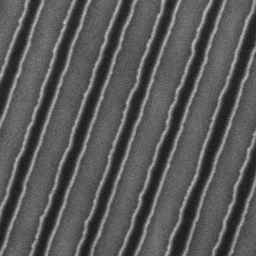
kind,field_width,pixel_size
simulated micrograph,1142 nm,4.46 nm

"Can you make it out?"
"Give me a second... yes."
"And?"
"lines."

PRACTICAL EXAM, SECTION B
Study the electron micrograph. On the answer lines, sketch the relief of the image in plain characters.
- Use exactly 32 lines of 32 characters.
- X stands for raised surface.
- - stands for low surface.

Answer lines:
---XX----XX----XX---XX----XX----
---XX----XX---XXX---XX----XX---X
--XXX---XX----XX----XX---XX----X
--XX----XX----XX---XX----XX----X
--XX----XX---XX----XX---XXX---XX
-XXX---XX----XX----XX---XX----XX
-XX----XX----XX---XX----XX---XXX
-XX----XX---XX----XX----XX---XX-
XXX---XX----XX---XXX---XX----XX-
XX----XX----XX---XX----XX----XX-
XX---XXX---XX----XX----XX---XX--
XX---XX----XX---XXX---XX----XX--
X----XX---XXX---XX----XX---XXX--
X---XXX---XX----XX---XXX---XXX--
X---XX----XX---XXX---XX----XX---
----XX---XXX---XX----XX---XXX---
---XXX---XX----XX---XXX---XX----
---XX----XX---XXX---XX----XX----
---XX---XXX---XX----XX---XXX---X
--XXX---XX----XX---XXX---XX----X
--XX----XX---XXX---XX----XX----X
--XX---XXX---XX----XX---XXX---XX
-XX----XX----XX---XX----XX----XX
-XX----XX---XX----XX----XX---XXX
-XX---XX----XX----XX---XXX---XX-
XX----XX----XX---XX----XX----XX-
XX----XX---XX----XX---XXX----XX-
XX---XX----XX----XX---XXX---XX--
X----XX----XX---XX----XX----XX--
X----XX---XX----XX---XXX---XXX--
X---XX----XX---XXX---XXX---XX---
----XX----XX---XX----XX----XX---